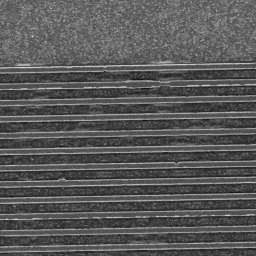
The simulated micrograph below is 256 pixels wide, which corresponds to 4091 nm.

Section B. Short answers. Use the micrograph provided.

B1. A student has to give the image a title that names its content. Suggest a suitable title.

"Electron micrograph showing parallel lines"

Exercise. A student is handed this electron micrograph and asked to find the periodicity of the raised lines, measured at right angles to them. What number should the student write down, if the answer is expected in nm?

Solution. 260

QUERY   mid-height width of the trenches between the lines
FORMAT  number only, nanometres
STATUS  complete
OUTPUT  166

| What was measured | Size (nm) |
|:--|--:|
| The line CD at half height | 95.9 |